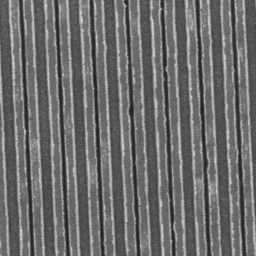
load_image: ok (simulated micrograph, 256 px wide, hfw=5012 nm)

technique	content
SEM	parallel lines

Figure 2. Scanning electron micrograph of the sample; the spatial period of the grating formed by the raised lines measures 339 nanometres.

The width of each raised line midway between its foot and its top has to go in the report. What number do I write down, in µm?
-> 0.186